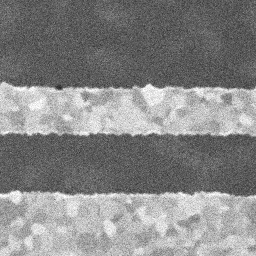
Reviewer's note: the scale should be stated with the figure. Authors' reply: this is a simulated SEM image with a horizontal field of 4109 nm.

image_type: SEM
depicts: one or a few lines or trenches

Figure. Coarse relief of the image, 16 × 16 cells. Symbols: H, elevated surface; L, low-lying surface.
LLLLLLLLLLLLLLLL
LLLLLLLLLLLLLLLL
LLLLLLLLLLLLLLLL
LLLLLLLLLLLLLLLL
LLLLLLLLLLLLLLLL
HLHLLLLLLHHLLLLL
HHHHHHHHHHHHHHHH
HHHHHHHHHHHHHHHH
LLLLLLLLLLLLLLLL
LLLLLLLLLLLLLLLL
LLLLLLLLLLLLLLLL
LLLLLLLLLLLLLLLL
HHHHHHHHHHHHHHHH
HHHHHHHHHHHHHHHH
HHHHHHHHHHHHHHHH
HHHHHHHHHHHHHHHH